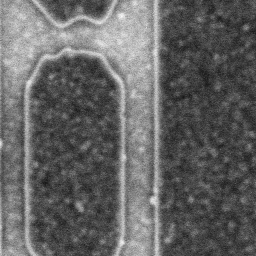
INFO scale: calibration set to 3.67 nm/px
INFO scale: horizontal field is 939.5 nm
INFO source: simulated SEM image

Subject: one or a few lines or trenches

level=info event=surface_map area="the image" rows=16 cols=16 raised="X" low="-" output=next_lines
---XXXX---XXXXXX
----------XXXXXX
----------XXXXXX
---XXX----XXXXXX
--XXXXX---XXXXXX
--XXXXXX--XXXXXX
--XXXXXX--XXXXXX
--XXXXXX--XXXXXX
--XXXXXX--XXXXXX
--XXXXXX--XXXXXX
--XXXXXX--XXXXXX
--XXXXXX--XXXXXX
--XXXXXX--XXXXXX
--XXXXXX--XXXXXX
--XXXXXX--XXXXXX
--XXXXXX--XXXXXX